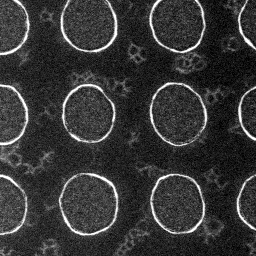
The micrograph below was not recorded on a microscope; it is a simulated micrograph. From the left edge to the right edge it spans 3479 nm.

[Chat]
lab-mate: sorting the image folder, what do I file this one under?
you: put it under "raised bodies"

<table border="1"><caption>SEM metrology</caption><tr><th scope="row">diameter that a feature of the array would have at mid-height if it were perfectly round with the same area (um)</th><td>0.779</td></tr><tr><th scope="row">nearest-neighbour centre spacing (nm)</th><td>1210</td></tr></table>